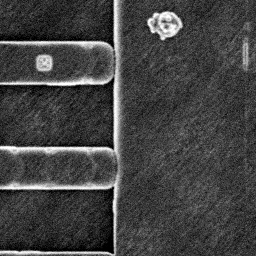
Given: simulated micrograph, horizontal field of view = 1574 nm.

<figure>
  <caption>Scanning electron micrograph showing wiring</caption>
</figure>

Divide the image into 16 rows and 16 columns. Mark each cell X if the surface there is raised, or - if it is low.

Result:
-------XXXXXXXXX
-------XXXXXXXXX
-------XXXXXXXXX
XXXXXXXXXXXXXXXX
XXXXXXXXXXXXXXXX
-------XXXXXXXXX
-------XXXXXXXXX
-------XXXXXXXXX
-------XXXXXXXXX
XXXXXXXXXXXXXXXX
XXXXXXXXXXXXXXXX
XXXXXXXXXXXXXXXX
-------XXXXXXXXX
-------XXXXXXXXX
-------XXXXXXXXX
-------XXXXXXXXX